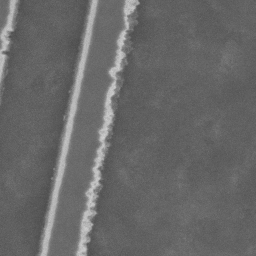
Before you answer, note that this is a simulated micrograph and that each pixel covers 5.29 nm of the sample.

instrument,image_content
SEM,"one or a few lines or trenches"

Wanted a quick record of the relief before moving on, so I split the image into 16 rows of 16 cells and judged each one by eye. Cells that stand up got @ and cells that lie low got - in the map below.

@-----@@--------
@-----@@--------
-----@@@--------
-----@@@--------
-----@@---------
-----@@---------
-----@@---------
----@@@---------
----@@----------
----@@----------
----@@----------
----@@----------
---@@@----------
---@@-----------
---@@-----------
---@@-----------